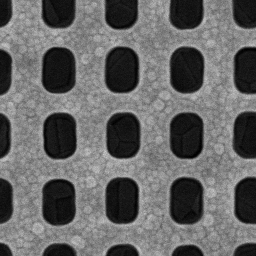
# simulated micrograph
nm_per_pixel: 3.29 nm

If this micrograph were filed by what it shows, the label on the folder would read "a regular array of holes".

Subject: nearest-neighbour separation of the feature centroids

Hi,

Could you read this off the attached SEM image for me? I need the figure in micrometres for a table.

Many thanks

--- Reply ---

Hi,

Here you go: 0.208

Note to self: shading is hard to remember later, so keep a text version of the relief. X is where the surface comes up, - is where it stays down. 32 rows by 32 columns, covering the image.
-XXXX----XXXX----XXXX----XXXX---
-XXXX----XXXX----XXXX----XXXX---
-XXXX----XXXX----XXXX----XXXX---
XXXXXXX-XXXXXX--XXXXXX--XXXXXXXX
XXXXXXXXXXXXXXXXXXXXXXXXXXXXXXXX
XXXXXXXXXXXXXXXXXXXXXXXXXXXXXXXX
-XXXXX---XXXXX---XXXXX---XXXXX--
-XXXX----XXXX----XXXX----XXXX---
--XXX----XXXX----XXXX-----XXX---
--XXX----XXXX----XXXX-----XXX---
-XXXX----XXXX----XXXX----XXXX---
-XXXXX--XXXXXX--XXXXXX--XXXXXX--
XXXXXXXXXXXXXXXXXXXXXXXXXXXXXXXX
XXXXXXXXXXXXXXXXXXXXXXXXXXXXXXXX
-XXXXX---XXXXX---XXXXX---XXXXX--
-XXXX----XXXX----XXXX----XXXX---
-XXXX-----XXX-----XXX----XXXX---
-XXXX-----XXX-----XXX----XXXX---
-XXXX----XXXX----XXXX----XXXX---
-XXXXX---XXXXX---XXXXX---XXXXX--
XXXXXXXXXXXXXXXXXXXXXXXXXXXXXXXX
XXXXXXXXXXXXXXXXXXXXXXXXXXXXXXXX
-XXXXX--XXXXXX---XXXXX---XXXXX--
-XXXX----XXXX----XXXX----XXXX---
-XXXX----XXXX----XXXX----XXXX---
--XXX----XXXX----XXXX----XXXX---
-XXXX----XXXX----XXXX----XXXX---
-XXXXX---XXXXX---XXXXX---XXXXX--
XXXXXXXXXXXXXXXXXXXXXXXXXXXXXXXX
XXXXXXXXXXXXXXXXXXXXXXXXXXXXXXXX
-XXXXXX-XXXXXXXXXXXXXXXXXXXXXX--
-XXXXX---XXXX----XXXXX---XXXX---